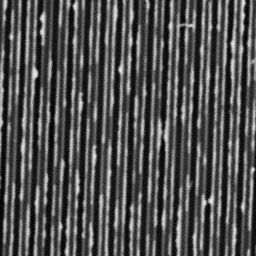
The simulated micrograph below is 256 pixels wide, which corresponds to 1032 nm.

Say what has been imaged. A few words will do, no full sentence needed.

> parallel lines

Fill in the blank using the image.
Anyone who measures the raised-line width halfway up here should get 0.0372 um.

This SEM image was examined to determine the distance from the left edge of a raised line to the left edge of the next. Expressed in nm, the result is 63.9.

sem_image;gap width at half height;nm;25.7